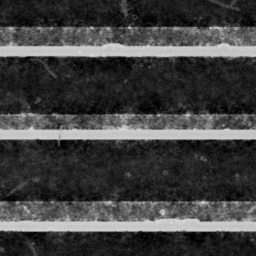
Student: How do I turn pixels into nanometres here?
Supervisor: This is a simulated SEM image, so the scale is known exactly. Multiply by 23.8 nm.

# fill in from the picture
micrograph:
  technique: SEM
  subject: lines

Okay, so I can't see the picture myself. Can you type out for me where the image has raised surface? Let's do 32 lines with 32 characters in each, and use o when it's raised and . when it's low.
................................
................................
................................
oooooooooooooooooooooooooooooooo
oooooooooooooooooooooooooooooooo
oooooooooooooooooooooooooooooooo
oooooooooooooooooooooooooooooooo
................................
................................
................................
................................
................................
................................
................................
oooooooooooooooooooooooooooooooo
oooooooooooooooooooooooooooooooo
oooooooooooooooooooooooooooooooo
................................
................................
................................
................................
................................
................................
................................
................................
oooooooooooooooooooooooooooooooo
oooooooooooooooooooooooooooooooo
oooooooooooooooooooooooooooooooo
oooooooooooooooooooooooooooooooo
................................
................................
................................